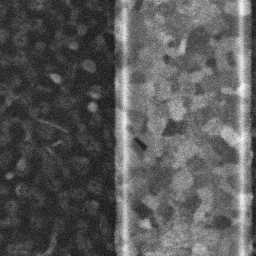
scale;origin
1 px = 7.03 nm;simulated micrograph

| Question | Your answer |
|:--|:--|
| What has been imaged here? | one or a few lines or trenches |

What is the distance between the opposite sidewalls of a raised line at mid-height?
820 nm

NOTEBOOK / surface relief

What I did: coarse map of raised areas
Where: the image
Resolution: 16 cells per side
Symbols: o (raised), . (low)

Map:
........ooooooo.
........ooooooo.
........ooooooo.
........ooooooo.
........ooooooo.
........ooooooo.
........ooooooo.
........ooooooo.
........ooooooo.
........ooooooo.
........ooooooo.
........ooooooo.
........ooooooo.
........ooooooo.
........ooooooo.
........ooooooo.